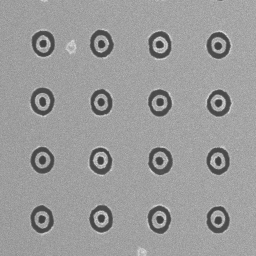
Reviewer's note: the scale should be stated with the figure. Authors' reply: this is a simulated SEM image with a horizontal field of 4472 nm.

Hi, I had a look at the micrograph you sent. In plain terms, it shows a regular array of ring-shaped grooves with a dot in the middle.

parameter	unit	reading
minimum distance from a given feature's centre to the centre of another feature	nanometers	1010